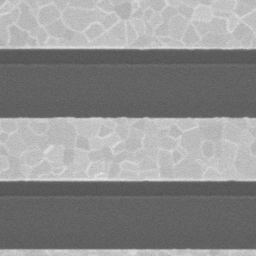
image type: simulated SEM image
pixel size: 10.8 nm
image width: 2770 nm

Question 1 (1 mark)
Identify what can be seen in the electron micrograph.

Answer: lines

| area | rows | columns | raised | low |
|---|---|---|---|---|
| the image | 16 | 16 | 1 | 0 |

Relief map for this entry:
1111111111111111
1111111111111111
1111111111111111
0000000000000000
0000000000000000
0000000000000000
0000000000000000
1111111111111111
1111111111111111
1111111111111111
1111111111111111
0000000000000000
0000000000000000
0000000000000000
0000000000000000
0000000000000000